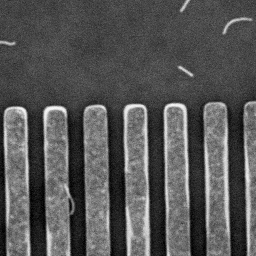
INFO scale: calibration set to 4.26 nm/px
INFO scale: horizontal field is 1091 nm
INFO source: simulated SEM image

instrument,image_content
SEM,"groups of lines, slits or small figures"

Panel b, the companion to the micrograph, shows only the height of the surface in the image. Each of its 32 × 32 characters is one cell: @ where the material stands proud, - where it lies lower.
--------------------------------
--------------------------------
--------------------------------
--------------------------------
--------------------------------
--------------------------------
--------------------------------
--------------------------------
--------------------------------
--------------------------------
--------------------------------
--------------------------------
--------------------------------
-@@--------@@---@@---@@---@@---@
-@@---@@---@@---@@---@@---@@---@
-@@---@@--@@@---@@---@@---@@---@
-@@---@@---@@---@@---@@---@@---@
-@@---@@---@@---@@---@@---@@---@
-@@---@@---@@---@@---@@---@@---@
-@@---@@---@@---@@---@@---@@---@
-@@---@@---@@---@@---@@---@@---@
-@@---@@---@@@--@@---@@---@@---@
-@@---@@---@@---@@---@@---@@---@
-@@---@@@--@@@--@@---@@---@@---@
-@@@--@@@--@@@--@@---@@---@@---@
-@@@--@@@--@@@--@@---@@---@@---@
-@@@--@@@--@@@--@@---@@@--@@---@
-@@@--@@@--@@@--@@---@@@--@@---@
-@@@--@@@--@@@--@@---@@@--@@---@
-@@@--@@@--@@@--@@---@@@--@@@--@
-@@@--@@@--@@@--@@---@@@--@@@--@
-@@@--@@@--@@@--@@---@@@--@@@--@